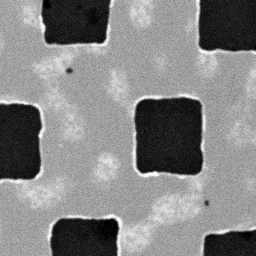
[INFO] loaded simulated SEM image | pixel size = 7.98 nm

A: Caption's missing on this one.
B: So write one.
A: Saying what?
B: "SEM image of holes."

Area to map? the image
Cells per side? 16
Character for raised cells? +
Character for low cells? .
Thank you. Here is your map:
+++....+++++....
+++....+++++....
+++...++++++....
++++++++++++++++
++++++++++++++++
++++++++++++++++
.++++++++...++++
...+++++.....+++
...+++++.....+++
...+++++.....+++
...++++++....+++
++++++++++++++++
++++++++++++++++
++++++++++++++++
+++....+++++++..
+++....++++++...